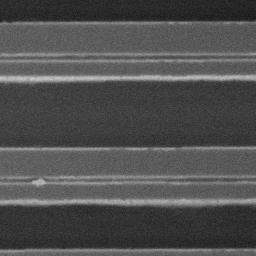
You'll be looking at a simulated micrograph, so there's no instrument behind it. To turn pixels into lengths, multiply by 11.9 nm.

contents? lines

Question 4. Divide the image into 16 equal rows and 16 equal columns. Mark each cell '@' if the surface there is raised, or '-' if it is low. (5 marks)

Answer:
----------------
@@@@@@@@@@@@@@@@
@@@@@@@@@@@@@@@@
@@@@@@@@@@@@@@@@
@@@@@@@@@@@@@@@@
----------------
----------------
----------------
----------------
@@@@@@@@@@@@@@@@
@@@@@@@@@@@@@@@@
@@@@@@@@@@@@@@@@
@@@@@@@@@@@@@@--
----------------
----------------
----------------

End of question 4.